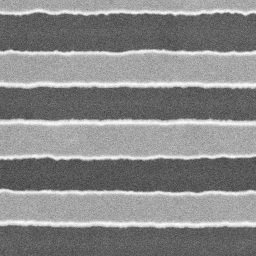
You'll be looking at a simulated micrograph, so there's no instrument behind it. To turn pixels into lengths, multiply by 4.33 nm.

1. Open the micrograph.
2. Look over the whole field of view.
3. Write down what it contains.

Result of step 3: lines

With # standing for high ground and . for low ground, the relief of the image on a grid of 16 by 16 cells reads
################
................
................
################
################
................
................
................
################
################
................
................
################
################
................
................